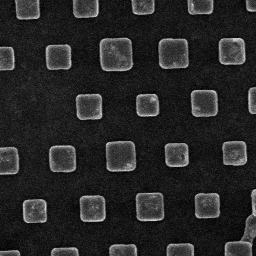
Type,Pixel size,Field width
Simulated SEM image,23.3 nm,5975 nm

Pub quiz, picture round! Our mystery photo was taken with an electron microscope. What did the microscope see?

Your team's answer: a regular array of raised bodies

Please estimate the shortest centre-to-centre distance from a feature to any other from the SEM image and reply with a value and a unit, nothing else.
1340 nm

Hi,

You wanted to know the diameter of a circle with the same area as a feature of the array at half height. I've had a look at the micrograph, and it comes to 0.654 microns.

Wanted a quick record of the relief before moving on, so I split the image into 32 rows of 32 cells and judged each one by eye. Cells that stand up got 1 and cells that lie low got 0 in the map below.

00111000011100000110000011000001
00111000011100000110000011000000
00000000000000000000000000000000
00000000000000000000000000000000
00000000000000000000000000000000
00000000000001110000111000011100
11000011100001110000111000001110
11000011100001110000111000001110
11000011000001110000100000000000
00000000000000000000000000000000
00000000000000000000000000000000
00000000000000000000000011100001
00000000001110000111000011100001
00000000001110000111000011100001
00000000001110000010000011000000
00000000000000000000000000000000
00000000000000000000000000000000
00000000000000000000000000000000
11000011100001111000011000001110
11000011100001111000011100001110
11000011100001111000011000001100
11000000000000000000000000000000
00000000000000000000000000000000
00000000000000000000000000000000
00000000000000000111000001100000
00011100001110000111000011100000
00011100001110000111000011100001
00011100001110000011000000000001
00000000000000000000000000000001
00000000000000000000000000000011
00000000000000000000000000001111
11000001110000111000011100001110